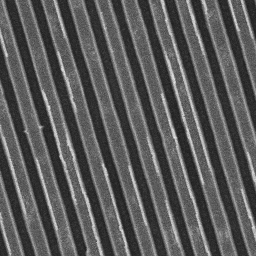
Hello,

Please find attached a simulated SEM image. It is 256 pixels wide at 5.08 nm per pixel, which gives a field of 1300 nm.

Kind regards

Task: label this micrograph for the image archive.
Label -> parallel lines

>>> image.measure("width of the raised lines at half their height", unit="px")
14.8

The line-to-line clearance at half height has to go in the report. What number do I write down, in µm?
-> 0.0555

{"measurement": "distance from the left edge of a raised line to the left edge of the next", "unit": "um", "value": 0.13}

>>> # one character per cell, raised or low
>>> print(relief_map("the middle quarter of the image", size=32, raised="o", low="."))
ooo...oooo...ooo...oooo...oooo..
ooo...oooo...oooo...ooo...oooo..
oooo...ooo...oooo...ooo....ooo..
oooo...ooo....ooo...oooo...ooo..
oooo...oooo...ooo....ooo...oooo.
.oooo..oooo...oooo...ooo...oooo.
.oooo...ooo...oooo...oooo...ooo.
.oooo...oooo...ooo...oooo...oooo
..ooo...oooo...oooo..oooo...oooo
..ooo....ooo...oooo...oooo..oooo
..oooo...ooo....ooo...oooo...ooo
..oooo...oooo...ooo...oooo...ooo
...ooo...oooo...oooo...ooo...ooo
...oooo...ooo...oooo...oooo...oo
...oooo...oooo..oooo...oooo...oo
o...ooo...oooo...oooo..oooo...oo
o...ooo....ooo...oooo...oooo..oo
o...oooo...ooo....ooo...oooo...o
o...oooo...oooo...ooo....ooo...o
oo...ooo...oooo...oooo...ooo...o
oo...oooo..oooo...oooo...oooo...
oo...oooo...oooo...ooo...oooo...
ooo...ooo...oooo...oooo...ooo...
ooo...oooo..oooo...oooo...oooo..
ooo...oooo...ooo...oooo...oooo..
ooo....ooo...oooo...ooo....ooo..
oooo...oooo..oooo...oooo...ooo..
oooo...oooo...ooo...oooo...oooo.
.ooo...oooo...ooo....ooo...oooo.
.oooo..oooo...oooo...oooo...ooo.
.oooo...oooo...ooo...oooo...oooo
..ooo...oooo...ooo....ooo...oooo